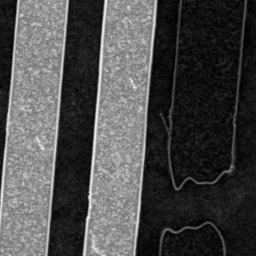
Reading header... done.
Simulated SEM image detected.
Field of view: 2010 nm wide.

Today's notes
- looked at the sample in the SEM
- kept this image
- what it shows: one or a few lines or trenches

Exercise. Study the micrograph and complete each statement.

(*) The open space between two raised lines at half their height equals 295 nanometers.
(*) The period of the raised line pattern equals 665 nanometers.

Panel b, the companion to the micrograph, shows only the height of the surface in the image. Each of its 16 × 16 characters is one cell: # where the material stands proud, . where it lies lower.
.###...###.####.
.###..####.####.
.###..####.####.
.###..###..####.
.###..###..####.
.###..###..####.
.###..###..####.
.###..###..####.
###...###..####.
###...###..####.
###...###..###..
###...###.......
###...###.......
###...###.......
###..####..###..
###..###..####..